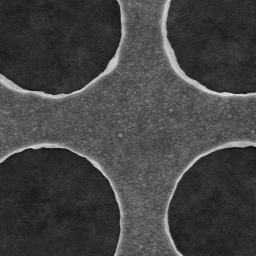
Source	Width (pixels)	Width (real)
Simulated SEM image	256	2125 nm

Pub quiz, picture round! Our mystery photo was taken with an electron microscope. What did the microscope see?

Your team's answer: holes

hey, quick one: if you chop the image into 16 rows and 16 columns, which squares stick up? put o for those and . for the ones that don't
........ooo.....
........oo......
........oo......
.......oooo.....
......ooooo.....
o....oooooooo...
oooooooooooooooo
oooooooooooooooo
oooooooooooooooo
o....oooooooo...
......oooooo....
.......oooo.....
.......oooo.....
........oo......
........ooo.....
.......oooo.....